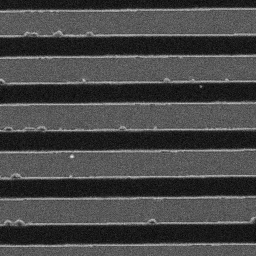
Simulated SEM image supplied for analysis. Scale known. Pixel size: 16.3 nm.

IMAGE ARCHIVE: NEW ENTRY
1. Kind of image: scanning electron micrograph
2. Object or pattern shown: lines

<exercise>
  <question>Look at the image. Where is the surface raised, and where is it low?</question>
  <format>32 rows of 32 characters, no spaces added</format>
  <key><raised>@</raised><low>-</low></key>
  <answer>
@@@@@@@@@@@@@@@@@@@@@@@@@@@@@@@@
--------------------------------
--------------------------------
--------------------------------
---@@-@@--@@@@@@@@@@@@@@@@@@@@@@
@@@@@@@@@@@@@@@@@@@@@@@@@@@@@@@@
@@@@@@@@@@@@@@@@@@@@@@@@@@@@@@@@
--------------------------------
--------------------------------
--------------------------------
@@@@@@@@@@@@@@@@@@@@@@@@@@@@@@@@
@@@@@@@@@@@@@@@@@@@@@@@@@@@@@@@@
@@@@@@@@@@@@@@@@@@@@@@@@@@@@@@@@
--------------------------------
--------------------------------
--------------------------------
@@@@@@@@@@@@@@@@@@@@@@@@@@@@@@@@
@@@@@@@@@@@@@@@@@@@@@@@@@@@@@@@@
@@@@@@@@@@@@@@@@@@@@@@@@@@@@@@@@
--------------------------------
--------------------------------
--------------------------------
@@@@@@@@@@@@@@@@@@@@@@@@@@@@@@@@
@@@@@@@@@@@@@@@@@@@@@@@@@@@@@@@@
@@@@@@@@@@@@@@@@@@@@@@@@@@@@@@@@
--------------------------------
--------------------------------
-------------------------------@
@@@@@@@@@@@@@@@@@@@@@@@@@@@@@@@@
@@@@@@@@@@@@@@@@@@@@@@@@@@@@@@@@
@@@@@@@@@@@@@@@@@@@@@@@@--------
--------------------------------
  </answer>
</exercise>